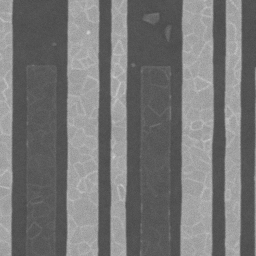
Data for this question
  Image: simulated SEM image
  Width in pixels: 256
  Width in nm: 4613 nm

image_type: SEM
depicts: wiring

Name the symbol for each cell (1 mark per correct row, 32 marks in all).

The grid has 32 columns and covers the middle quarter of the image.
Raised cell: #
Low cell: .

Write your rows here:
.#######....####..............#.
.########...####....######....#.
.########...###.....######....##
.########...###.....######....##
.########...###.....######....##
.########...###.....######....##
.########...###.....######....##
.########...###.....######....##
.########...###.....######....##
.#######....#.#.....######....##
.#######............######....##
.#######............#####.....##
.#######....##.....#####......##
.#######....###....#####......##
.#######....###....#######....#.
.#######....###....#..####....#.
.#######....###.......####....##
.#######....###.....######....#.
.#######....###.....######....##
.#######....####....######....##
.#######....####...#######.....#
.#######....####...#######.....#
.#######....###....#######....##
.#######....###....#######....##
.#######....###....#######....##
.#######....###.....#####.....##
.#######....###.....####......##
.#######....###......###........
.#######....###......###........
.#######....###......####.....##
.#######....#.........####....##
.#######....#........#####....##